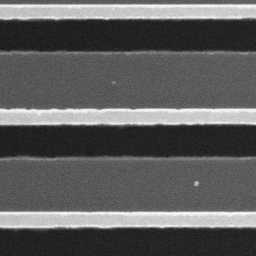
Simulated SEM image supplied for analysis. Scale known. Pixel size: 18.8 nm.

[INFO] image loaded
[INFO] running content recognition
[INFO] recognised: lines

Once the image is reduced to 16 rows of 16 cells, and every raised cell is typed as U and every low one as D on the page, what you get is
UUUUUUUUUUUUUUUU
DDDDDDDDDDDDDDDD
DDDDDDDDDDDDDDDD
UUUUUUUUUUUUUUUU
UUUUUUUUUUUUUUUU
UUUUUUUUUUUUUUUU
UUUUUUUUUUUUUUUU
UUUUUUUUUUUUUUUU
DDDDDDDDDDDDDDDD
DDDDDDDDDDDDDDDD
UUUUUUUUUUUUUUUU
UUUUUUUUUUUUUUUU
UUUUUUUUUUUUUUUU
UUUUUUUUUUUUUUUU
DDDDDDDDDDDDDDDD
DDDDDDDDDDDDDDDD